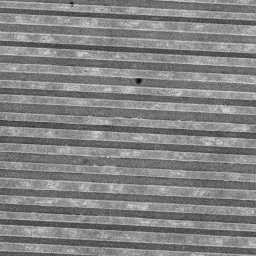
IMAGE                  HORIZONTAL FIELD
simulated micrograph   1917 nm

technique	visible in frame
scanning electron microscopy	parallel lines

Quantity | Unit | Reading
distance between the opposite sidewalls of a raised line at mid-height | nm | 58.9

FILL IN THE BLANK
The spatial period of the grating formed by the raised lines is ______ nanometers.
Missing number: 121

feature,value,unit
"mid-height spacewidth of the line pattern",58.9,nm